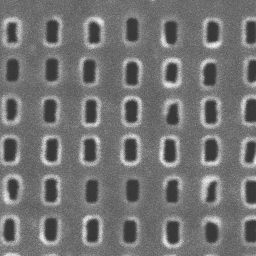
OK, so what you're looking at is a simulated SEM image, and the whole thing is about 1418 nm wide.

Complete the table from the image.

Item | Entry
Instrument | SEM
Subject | a regular array of holes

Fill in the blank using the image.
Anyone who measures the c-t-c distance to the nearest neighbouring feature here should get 211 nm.